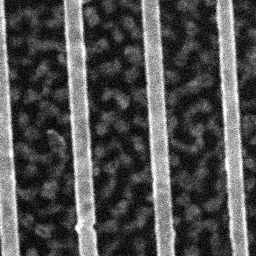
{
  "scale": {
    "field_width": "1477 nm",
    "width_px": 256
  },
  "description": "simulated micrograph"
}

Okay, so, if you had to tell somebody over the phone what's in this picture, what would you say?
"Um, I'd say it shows one or a few lines or trenches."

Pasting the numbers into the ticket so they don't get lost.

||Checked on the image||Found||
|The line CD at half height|88.6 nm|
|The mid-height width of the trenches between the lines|61.4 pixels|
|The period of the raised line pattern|437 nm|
